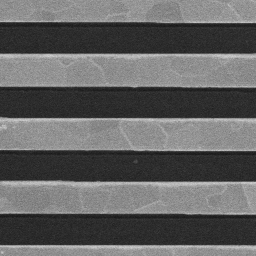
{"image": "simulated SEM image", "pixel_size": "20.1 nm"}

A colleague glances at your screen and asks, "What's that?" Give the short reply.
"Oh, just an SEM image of lines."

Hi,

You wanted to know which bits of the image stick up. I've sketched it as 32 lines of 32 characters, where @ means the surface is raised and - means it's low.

@@@@@@@@@@@@@@@@@@@@@@@@@@@@@@@@
@@@@@@@@@@@@@@@@@@@@@@@@@@@@@@@@
@@@@@@@@@@@@@@@@@@@@@@@@@@@@@@@@
--------------------------------
--------------------------------
--------------------------------
--------------------------------
@@@@@@@@@@@@@@@@@@@@@@@@@@@@@@@@
@@@@@@@@@@@@@@@@@@@@@@@@@@@@@@@@
@@@@@@@@@@@@@@@@@@@@@@@@@@@@@@@@
@@@@@@@@@@@@@@@@@@@@@@@@@@@@@@@@
--------------------------------
--------------------------------
--------------------------------
--------------------------------
@@@@@@@@@@@@@@@@@@@@@@@@@@@@@@@@
@@@@@@@@@@@@@@@@@@@@@@@@@@@@@@@@
@@@@@@@@@@@@@@@@@@@@@@@@@@@@@@@@
@@@@@@@@@@@@@@@@@@@@@@@@@@@@@@@@
--------------------------------
--------------------------------
--------------------------------
--------------------------------
@@@@@@@@@@@@@@@@@@@@@@@@@@@@@@@@
@@@@@@@@@@@@@@@@@@@@@@@@@@@@@@@@
@@@@@@@@@@@@@@@@@@@@@@@@@@@@@@@@
@@@@@@@@@@@@@@@@@@@@@@@@@@@@@@@@
--------------------------------
--------------------------------
--------------------------------
--------------------------------
@@@@@@@@@@@@@@@@@@@@@@@@@@@@@@@@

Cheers